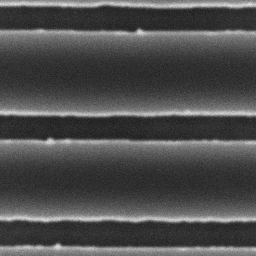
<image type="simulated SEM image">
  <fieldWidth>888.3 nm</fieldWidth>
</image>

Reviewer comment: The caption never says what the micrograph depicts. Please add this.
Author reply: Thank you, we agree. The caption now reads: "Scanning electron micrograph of lines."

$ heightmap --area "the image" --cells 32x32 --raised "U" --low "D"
UUUUUUUUUUUUUUUUUUUUUUUUUUUUUUUU
DDDDDDDDDDDDDDDDDDDDDDDDDDDDDDDD
DDDDDDDDDDDDDDDDDDDDDDDDDDDDDDDD
DDDDDDDDDDDDDDDDDDDDDDDDDDDDDDDD
UUUUUUUUUUUUUUUUUUUUUUUUUUUUUUUU
UUUUUUUUUUUUUUUUUUUUUUUUUUUUUUUU
UUUUUUUUUUUUUUUUUUUUUUUUUUUUUUUU
UUUUUUUUUUUUUUUUUUUUUUUUUUUUUUUU
UUUUUUUUUUUUUUUUUUUUUUUUUUUUUUUU
UUUUUUUUUUUUUUUUUUUUUUUUUUUUUUUU
UUUUUUUUUUUUUUUUUUUUUUUUUUUUUUUU
UUUUUUUUUUUUUUUUUUUUUUUUUUUUUUUU
UUUUUUUUUUUUUUUUUUUUUUUUUUUUUUUU
UUUUUUUUUUUUUUUUUUUUUUUUUUUUUUUU
DDDDDDDDDDDDDDDDDDDDDDDDDDDDDDDD
DDDDDDDDDDDDDDDDDDDDDDDDDDDDDDDD
DDDDDDDDDDDDDDDDDDDDDDDDDDDDDDDD
DDDDDDUDUDDDDDDDDDDDDDDDDDDDDDDD
UUUUUUUUUUUUUUUUUUUUUUUUUUUUUUUU
UUUUUUUUUUUUUUUUUUUUUUUUUUUUUUUU
UUUUUUUUUUUUUUUUUUUUUUUUUUUUUUUU
UUUUUUUUUUUUUUUUUUUUUUUUUUUUUUUU
UUUUUUUUUUUUUUUUUUUUUUUUUUUUUUUU
UUUUUUUUUUUUUUUUUUUUUUUUUUUUUUUU
UUUUUUUUUUUUUUUUUUUUUUUUUUUUUUUU
UUUUUUUUUUUUUUUUUUUUUUUUUUUUUUUU
UUUUUUUUUUUUUUUUUUUUUUUUUUUUUUUU
DUDUUUUUDDUUUDUUUUUUUUUUUUUUUUUU
DDDDDDDDDDDDDDDDDDDDDDDDDDDDDDDD
DDDDDDDDDDDDDDDDDDDDDDDDDDDDDDDD
DDDDDDDDDDDDDDDDDDDDDDDDDDDDDDDD
UUUUUUUUUUUUUUUUUUUUUUUUUUUUUUUU